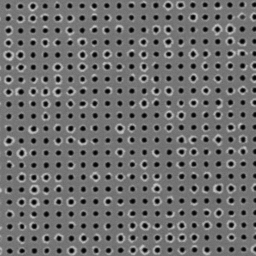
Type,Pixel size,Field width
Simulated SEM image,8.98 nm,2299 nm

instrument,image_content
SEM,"a regular array of holes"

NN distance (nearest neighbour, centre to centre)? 0.108 microns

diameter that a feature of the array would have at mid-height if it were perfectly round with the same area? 44.2 nm